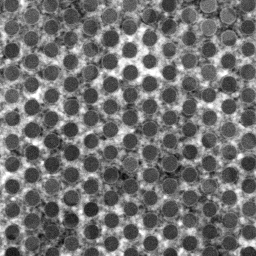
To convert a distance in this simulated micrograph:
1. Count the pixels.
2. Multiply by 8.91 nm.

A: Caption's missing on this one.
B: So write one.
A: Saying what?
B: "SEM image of a regular array of raised bodies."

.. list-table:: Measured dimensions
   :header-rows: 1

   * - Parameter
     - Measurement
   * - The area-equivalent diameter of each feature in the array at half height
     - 146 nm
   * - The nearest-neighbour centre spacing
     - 200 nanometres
